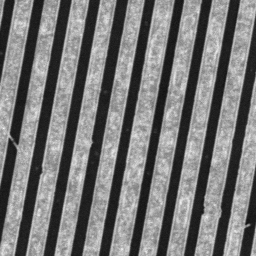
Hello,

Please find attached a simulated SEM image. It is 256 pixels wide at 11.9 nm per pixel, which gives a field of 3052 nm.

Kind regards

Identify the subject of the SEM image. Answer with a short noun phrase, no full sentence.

parallel lines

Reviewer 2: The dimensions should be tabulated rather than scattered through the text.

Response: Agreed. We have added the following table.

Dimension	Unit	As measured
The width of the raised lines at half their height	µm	0.191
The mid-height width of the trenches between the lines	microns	0.144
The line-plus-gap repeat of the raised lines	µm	0.33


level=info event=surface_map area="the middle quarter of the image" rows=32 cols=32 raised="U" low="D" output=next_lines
UUUDDDUUUUDDDUUUUDDDUUUUUDDUUUUD
UUUDDDUUUUDDDUUUUDDDUUUUDDDUUUUD
UUUDDDUUUUDDDUUUUDDDUUUUDDDUUUUD
UUUDDDUUUUDDDUUUDDDDUUUUDDDUUUUD
UUDDDDUUUDDDDUUUDDDUUUUUDDUUUUDD
UUDDDUUUUDDDUUUUDDDUUUUDDDUUUUDD
UUDDDUUUUDDDUUUUDDDUUUUDDDUUUUDD
UUDDDUUUUDDDUUUUDDDUUUUDDDUUUUDD
UUDDDUUUUDDDUUUDDDDUUUUDDDUUUUDD
UDDDDUUUDDDDUUUDDDUUUUUDDDUUUUDD
UDDDDUUUDDDDUUUDDDUUUUUDDDUUUDDD
UDDDUUUUDDDDUUUDDDUUUUUDDUUUUDDD
UDDDUUUUDDDUUUUDDDUUUUDDDUUUUDDD
UDDDUUUUDDDUUUUDDDUUUUDDDUUUUDDD
DDDDUUUUDDDUUUDDDDUUUUDDDUUUUDDD
DDDDUUUDDDDUUUDDDUUUUUDDDUUUDDDD
DDDDUUUDDDUUUUDDDUUUUUDDUUUUDDDU
DDDUUUUDDDUUUUDDDUUUUDDDUUUUDDDU
DDDUUUUDDDUUUUDDDUUUUDDDUUUUDDDU
DDDUUUUDDDUUUUDDDUUUUDDDUUUUDDDU
DDDUUUUDDDUUUDDDUUUUUDDDUUUUDDDU
DDDUUUDDDDUUUDDDUUUUUDDUUUUDDDDU
DDUUUUDDDDUUUDDDUUUUUDDUUUUDDDUU
DDUUUUDDDUUUUDDDUUUUDDDUUUUDDDUU
DDUUUUDDDUUUUDDDUUUUDDDUUUUDDDUU
DDUUUUDDDUUUDDDDUUUUDDDUUUUDDDUU
DDUUUDDDDUUUDDDUUUUUDDDUUUDDDDUU
DDUUUDDDDUUUDDDUUUUUDDUUUUDDDUUU
DUUUUDDDUUUUDDDUUUUDDDUUUUDDDUUU
DUUUUDDDUUUUDDDUUUUDDDUUUUDDDUUU
DUUUUDDDUUUUDDDUUUUDDDUUUUDDDUUU
DUUUUDDDUUUDDDDUUUUDDDUUUUDDDUUU